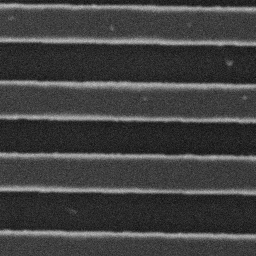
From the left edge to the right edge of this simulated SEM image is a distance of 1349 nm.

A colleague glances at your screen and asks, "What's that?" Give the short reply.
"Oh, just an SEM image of lines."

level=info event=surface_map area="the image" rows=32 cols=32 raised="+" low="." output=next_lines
................................
++++++++++++++++++++++++++++++++
++++++++++++++++++++++++++++++++
++++++++++++++++++++++++++++++++
++++++++++++++++++++++++++++++++
.......................+++++++++
................................
................................
................................
................................
+++++++++++++++++++++...........
++++++++++++++++++++++++++++++++
++++++++++++++++++++++++++++++++
++++++++++++++++++++++++++++++++
++++++++++++++++++++++++++++++++
................................
................................
................................
................................
+++++++++++++++++++++++++.++....
++++++++++++++++++++++++++++++++
++++++++++++++++++++++++++++++++
++++++++++++++++++++++++++++++++
++++++++++++++++++++++++++++++++
................................
................................
................................
................................
................................
++++++++++++++++++++++++++++++++
++++++++++++++++++++++++++++++++
++++++++++++++++++++++++++++++++